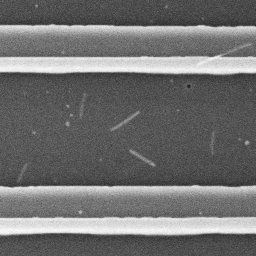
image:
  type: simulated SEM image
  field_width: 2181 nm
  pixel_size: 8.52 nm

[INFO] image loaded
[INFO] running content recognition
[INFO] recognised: lines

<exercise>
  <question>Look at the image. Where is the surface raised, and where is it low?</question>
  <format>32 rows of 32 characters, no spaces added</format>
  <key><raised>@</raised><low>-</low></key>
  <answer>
--------------------------------
--------------------------------
--------------------------------
@@@@@@@@@@@@@@@@@@@@@@@@@@@@@@@@
@@@@@@@@@@@@@@@@@@@@@@@@@@@@@@@@
@@@@@@@@@@@@@@@@@@@@@@@@@@@@@@@@
@@@@@@@@@@@@@@@@@@@@@@@@@@@@@@@@
@@@@@@@@@@@@@@@@@@@@@@@@@@@@@@@@
@@@@@@@@@@@@@@@@@@@@@@@@@@@@@@@@
--------------------------------
--------------------------------
--------------------------------
--------------------------------
--------------------------------
--------------------------------
--------------------------------
--------------------------------
--------------------------------
--------------------------------
--------------------------------
--------------------------------
--------------------------------
--------------------------------
@@@@@@@@@@@@@@@@@@@@@@@@@@@@@@@@
@@@@@@@@@@@@@@@@@@@@@@@@@@@@@@@@
@@@@@@@@@@@@@@@@@@@@@@@@@@@@@@@@
@@@@@@@@@@@@@@@@@@@@@@@@@@@@@@@@
@@@@@@@@@@@@@@@@@@@@@@@@@@@@@@@@
@@@@@@@@@@@@@@@@@@@@@@@@@@@@@@@@
--------------------------------
--------------------------------
--------------------------------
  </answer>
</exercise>